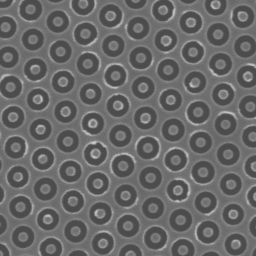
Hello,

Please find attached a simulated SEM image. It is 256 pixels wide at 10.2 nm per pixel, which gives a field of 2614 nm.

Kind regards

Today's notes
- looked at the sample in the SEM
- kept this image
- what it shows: a regular array of ring-shaped grooves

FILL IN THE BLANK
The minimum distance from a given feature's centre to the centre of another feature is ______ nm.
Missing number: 305